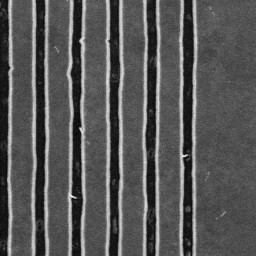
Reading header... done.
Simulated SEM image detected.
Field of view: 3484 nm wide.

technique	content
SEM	parallel lines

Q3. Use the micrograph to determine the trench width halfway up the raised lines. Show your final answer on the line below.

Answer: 0.155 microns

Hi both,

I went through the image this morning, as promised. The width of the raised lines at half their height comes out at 344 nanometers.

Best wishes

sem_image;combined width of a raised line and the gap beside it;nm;502